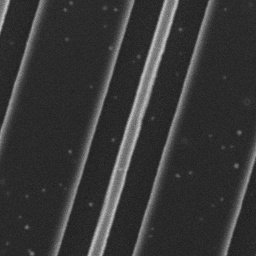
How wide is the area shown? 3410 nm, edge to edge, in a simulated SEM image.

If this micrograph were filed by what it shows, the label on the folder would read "lines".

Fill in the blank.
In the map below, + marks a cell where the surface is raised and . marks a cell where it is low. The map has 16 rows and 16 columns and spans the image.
..++++++.....+++
..++++++.....+++
..++++++....++++
.++++++.....++++
.++++++.....++++
.++++++....+++++
.+++++.....+++++
++++++.....+++++
++++++.....+++++
+++++.....++++++
+++++.....++++++
+++++.....+++++.
+++++....++++++.
++++.....++++++.
++++.....++++++.
++++....++++++..